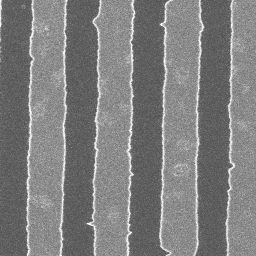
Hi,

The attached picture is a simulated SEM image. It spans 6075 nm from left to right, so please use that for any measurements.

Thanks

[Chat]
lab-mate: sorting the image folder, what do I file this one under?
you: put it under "one or a few lines or trenches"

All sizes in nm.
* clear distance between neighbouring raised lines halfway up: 756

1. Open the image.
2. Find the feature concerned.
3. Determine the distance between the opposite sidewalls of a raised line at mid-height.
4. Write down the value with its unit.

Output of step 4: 825 nm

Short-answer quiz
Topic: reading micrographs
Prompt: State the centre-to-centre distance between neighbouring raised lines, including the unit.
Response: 1590 nanometers